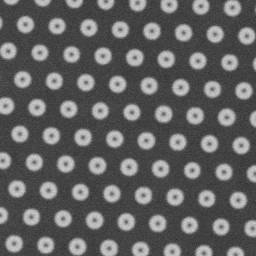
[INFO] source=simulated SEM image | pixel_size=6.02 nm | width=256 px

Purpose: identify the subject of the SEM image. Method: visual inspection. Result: an array of small figures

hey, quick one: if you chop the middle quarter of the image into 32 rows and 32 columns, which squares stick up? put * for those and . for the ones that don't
........................***.....
................................
................................
....***.....***......*..........
...****....****....****.....***.
....***....****....****....****.
.....*......***....****....****.
.....................*......**..
................................
**..............................
***....****.....**..............
***....****....****....****....*
***....****....****....****....*
........**......**.....****....*
........................**.....*
................................
....**..........................
...****....***.....***..........
...****....****....****....***..
...****....****....****...*****.
...........***.....***.....***..
............................*...
................................
**.....**.......................
***...****.....***.....**.......
**....****....****....****....**
**.....***....****....****....**
...............***....****....**
...............................*
................................
...**......**...................
..****....****....****....***...